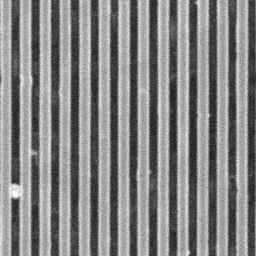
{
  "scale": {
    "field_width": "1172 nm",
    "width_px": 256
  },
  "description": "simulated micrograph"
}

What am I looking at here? parallel lines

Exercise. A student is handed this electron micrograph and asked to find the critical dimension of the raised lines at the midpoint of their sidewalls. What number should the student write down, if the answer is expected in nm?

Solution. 48.6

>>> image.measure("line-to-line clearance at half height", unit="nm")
44.6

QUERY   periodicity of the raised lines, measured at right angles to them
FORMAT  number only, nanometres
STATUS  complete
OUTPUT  90.1